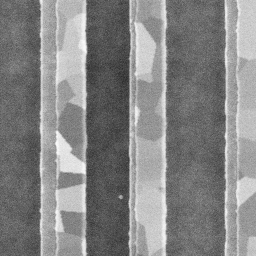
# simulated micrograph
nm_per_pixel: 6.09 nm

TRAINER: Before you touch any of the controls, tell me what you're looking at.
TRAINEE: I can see lines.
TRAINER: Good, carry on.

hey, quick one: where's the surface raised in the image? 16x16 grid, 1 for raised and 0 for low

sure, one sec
0001100011000011
0001100011000011
0001100011000011
0001100011000011
0001100011000011
0001100011000011
0001100011000011
0001100011000011
0001100011000011
0001100011000011
0001100011000011
0001100011000011
0001100011000011
0001100011000011
0001100011000011
0001100011000011